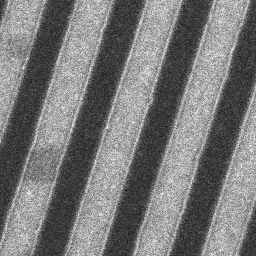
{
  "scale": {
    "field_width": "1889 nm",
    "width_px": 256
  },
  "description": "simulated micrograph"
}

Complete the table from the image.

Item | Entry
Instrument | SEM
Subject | one or a few lines or trenches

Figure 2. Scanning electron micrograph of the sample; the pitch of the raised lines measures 0.48 microns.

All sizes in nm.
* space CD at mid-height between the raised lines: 231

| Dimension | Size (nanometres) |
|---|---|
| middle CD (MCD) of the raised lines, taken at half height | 251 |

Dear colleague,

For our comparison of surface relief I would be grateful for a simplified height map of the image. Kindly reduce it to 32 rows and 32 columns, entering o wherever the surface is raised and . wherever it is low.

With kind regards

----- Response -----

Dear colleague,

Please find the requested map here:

o....ooooo....oooo....ooooo....o
o....oooo.....oooo....oooo.....o
.....oooo....ooooo....oooo....oo
....ooooo....oooo....ooooo....oo
....oooo.....oooo....ooooo....oo
....oooo....ooooo....oooo....ooo
....oooo....oooo....ooooo....ooo
...oooo.....oooo....ooooo....ooo
...oooo....ooooo....oooo....oooo
...oooo....oooo.....oooo....oooo
..oooo.....oooo....ooooo....oooo
..oooo....ooooo....oooo....ooooo
..oooo....oooo.....oooo....ooooo
.ooooo....oooo....ooooo....oooo.
.oooo....ooooo....oooo....ooooo.
.oooo....ooooo....oooo....ooooo.
ooooo....oooo....ooooo....oooo..
ooooo...ooooo....oooo.....oooo..
oooo....ooooo....oooo....ooooo..
oooo....oooo....ooooo....oooo...
ooo....ooooo....oooo.....oooo...
ooo....ooooo....oooo....ooooo...
ooo....oooo....ooooo....oooo....
oo....ooooo....ooooo....oooo....
oo....ooooo....oooo....ooooo....
oo....oooo.....oooo....oooo.....
o.....oooo....ooooo....oooo....o
o....ooooo....oooo....ooooo....o
o....oooo.....oooo....oooo.....o
.....oooo....oooo.....oooo....oo
....ooooo....oooo....ooooo....oo
....oooo.....oooo....ooooo....oo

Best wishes